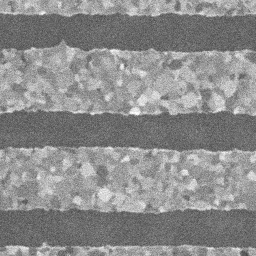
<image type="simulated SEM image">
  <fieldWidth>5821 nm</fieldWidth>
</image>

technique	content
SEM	one or a few lines or trenches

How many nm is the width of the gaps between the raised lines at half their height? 838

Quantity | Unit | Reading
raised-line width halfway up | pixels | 61.1